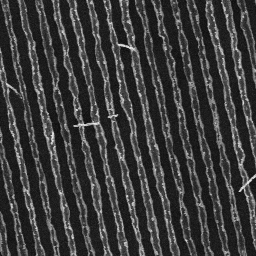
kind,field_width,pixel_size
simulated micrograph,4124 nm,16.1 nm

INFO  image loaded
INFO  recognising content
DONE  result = parallel lines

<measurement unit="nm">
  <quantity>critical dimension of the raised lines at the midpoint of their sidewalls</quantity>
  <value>94.6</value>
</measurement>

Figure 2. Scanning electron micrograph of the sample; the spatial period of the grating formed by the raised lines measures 267 nanometres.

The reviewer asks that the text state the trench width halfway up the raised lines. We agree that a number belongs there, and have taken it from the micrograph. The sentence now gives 172 nanometres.